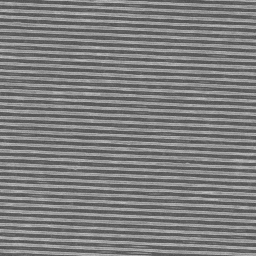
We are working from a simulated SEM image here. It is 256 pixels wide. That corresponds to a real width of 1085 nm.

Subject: parallel lines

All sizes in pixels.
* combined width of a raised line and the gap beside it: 6.67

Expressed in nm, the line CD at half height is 11.6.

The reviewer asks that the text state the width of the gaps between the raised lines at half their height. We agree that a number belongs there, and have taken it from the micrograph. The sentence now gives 15.9 nanometers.